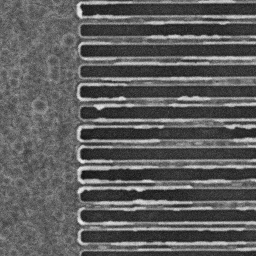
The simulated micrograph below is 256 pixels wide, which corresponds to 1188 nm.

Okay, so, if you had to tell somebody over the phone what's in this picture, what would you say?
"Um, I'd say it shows parallel lines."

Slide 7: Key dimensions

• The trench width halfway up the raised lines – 12.6 px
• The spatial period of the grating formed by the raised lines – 0.0958 microns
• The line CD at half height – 0.0401 um